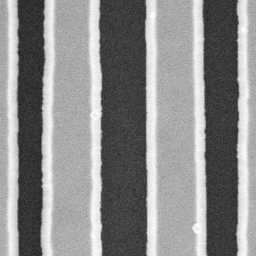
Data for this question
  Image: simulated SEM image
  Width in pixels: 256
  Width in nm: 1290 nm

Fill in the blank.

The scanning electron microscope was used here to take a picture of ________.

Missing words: lines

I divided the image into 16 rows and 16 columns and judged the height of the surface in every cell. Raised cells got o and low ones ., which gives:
o..ooo...ooo...o
o..ooo...ooo...o
o..ooo...oooo..o
o..ooo...oooo..o
o..ooo...oooo..o
o..ooo...oooo..o
o..ooo...oooo..o
o..ooo...oooo..o
o..ooo...oooo..o
o..ooo...oooo..o
o..ooo...oooo..o
o..ooo...oooo..o
o..ooo...oooo..o
o..ooo...oooo..o
o..ooo...oooo..o
o..ooo...oooo..o